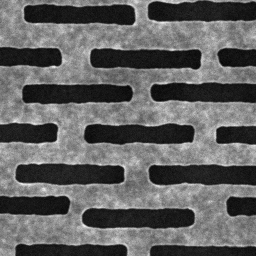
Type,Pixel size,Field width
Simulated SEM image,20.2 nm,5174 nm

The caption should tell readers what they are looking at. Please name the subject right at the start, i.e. holes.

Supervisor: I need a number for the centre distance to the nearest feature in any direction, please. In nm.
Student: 1570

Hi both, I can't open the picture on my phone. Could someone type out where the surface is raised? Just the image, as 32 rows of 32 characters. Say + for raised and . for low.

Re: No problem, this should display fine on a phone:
+++++.+++++++++++++.............
+++..............+..............
+++..............++.............
++++++++++++++++++++++++++++++++
++++++++++++++++++++++++++++++++
++++++++++++++++++++++++++++++++
........+++..............++.....
........+++..............++.....
++++++++++++.............+++++++
++++++++++++++++++++++++++++++++
++++....+++++++++++++...........
+++..............++.............
+++.............+++.............
++++++++++++++++++++++++++++++++
++++++++++++++++++++++++++++++++
....+..++++++++++++++.++++++++++
.......++++.............+++.....
.......++++.............+++.....
++++++++++++++++++++++++++++++++
++++++++++++++++++++++++++++++++
+++......+.+++++++++++++++.+++++
++..............+++.............
++.............++++.............
++++++++++++++++++++++++++++++++
.+.+++++++++++++++++++++++++++++
.........+++++++++++++++++++....
........+++.............++++....
++++++++++..............++++++++
+++++++++++++.........++++++++++
++++++++++++++++++++++++++++++++
++++....++++++++++++++++++++++++
++..............+++.............